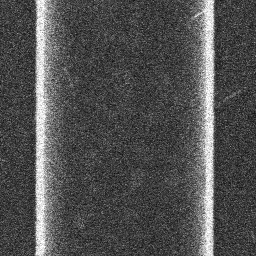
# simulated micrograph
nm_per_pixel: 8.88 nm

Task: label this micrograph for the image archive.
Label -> one or a few lines or trenches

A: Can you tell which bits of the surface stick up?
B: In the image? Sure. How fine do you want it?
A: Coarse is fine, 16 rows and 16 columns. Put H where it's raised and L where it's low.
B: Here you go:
LLLHHHHHHHHHHLLL
LLLHHHHHHHHHHLLL
LLLHHHHHHHHHHLLL
LLLHHHHHHHHHHLLL
LLLHHHHHHHHHHLLL
LLLHHHHHHHHHHLLL
LLLHHHHHHHHHHLLL
LLLHHHHHHHHHHLLL
LLLHHHHHHHHHHLLL
LLLHHHHHHHHHHLLL
LLLHHHHHHHHHHLLL
LLLHHHHHHHHHHLLL
LLLHHHHHHHHHHLLL
LLLHHHHHHHHHHLLL
LLLHHHHHHHHHHLLL
LLLHHHHHHHHHHLLL